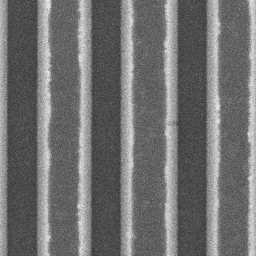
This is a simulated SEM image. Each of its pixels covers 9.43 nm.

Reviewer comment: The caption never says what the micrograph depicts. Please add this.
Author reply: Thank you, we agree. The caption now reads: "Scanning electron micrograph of one or a few lines or trenches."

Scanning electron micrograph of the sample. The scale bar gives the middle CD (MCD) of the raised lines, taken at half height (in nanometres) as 437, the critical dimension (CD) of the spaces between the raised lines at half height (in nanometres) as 362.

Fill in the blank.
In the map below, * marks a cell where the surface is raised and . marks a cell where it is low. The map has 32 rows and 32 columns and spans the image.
.....******.....******....******
.....******.....******....******
.....******.....******....******
.....******.....******....******
.....******.....******....******
.....******.....******....******
.....******.....******....******
.....******.....******....******
.....******.....******....******
.....******.....******....******
.....******.....******....******
.....******.....******....******
.....******.....******....******
.....******.....******....******
.....******.....******....******
.....******.....******....******
.....******.....******....******
.....******.....******....******
.....******.....******....******
.....******.....******....******
.....******.....******....******
.....******.....******....******
.....******.....******....******
.....******.....******....******
.....******.....******....******
.....******.....******....******
.....******.....******....******
.....******.....******....******
.....******.....******....******
.....******.....******....******
.....******.....******....******
.....******.....******....******